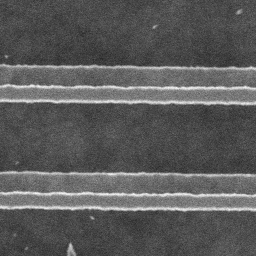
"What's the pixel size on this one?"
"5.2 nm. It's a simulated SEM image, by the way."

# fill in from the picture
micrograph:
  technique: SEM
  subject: lines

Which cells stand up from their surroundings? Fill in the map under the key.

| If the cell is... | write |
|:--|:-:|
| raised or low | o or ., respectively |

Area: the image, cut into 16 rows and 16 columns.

................
................
................
................
oooooooooooooooo
oooooooooooooooo
...............o
................
................
................
................
oooooooooooooooo
oooooooooooooooo
................
................
................